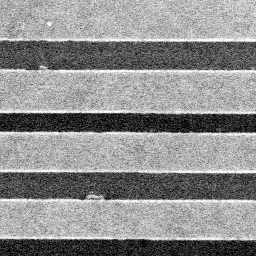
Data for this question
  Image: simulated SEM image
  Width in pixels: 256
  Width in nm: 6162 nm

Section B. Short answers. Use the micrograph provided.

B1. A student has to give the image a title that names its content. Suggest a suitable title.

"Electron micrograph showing lines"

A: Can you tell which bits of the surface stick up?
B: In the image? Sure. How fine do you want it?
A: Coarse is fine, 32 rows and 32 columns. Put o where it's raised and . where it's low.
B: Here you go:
oooooooooooooooooooooooooooooooo
oooooooooooooooooooooooooooooooo
oooooooooooooooooooooooooooooooo
oooooooooooooooooooooooooooooooo
oooooooooooooooooooooooooooooooo
................................
................................
................................
................................
oooooooooooooooooooooooooooooooo
oooooooooooooooooooooooooooooooo
oooooooooooooooooooooooooooooooo
oooooooooooooooooooooooooooooooo
oooooooooooooooooooooooooooooooo
................................
................................
................................
oooooooooooooooooooooooooooooooo
oooooooooooooooooooooooooooooooo
oooooooooooooooooooooooooooooooo
oooooooooooooooooooooooooooooooo
......................oooooooooo
................................
................................
................................
oooooooooooooooooooooooooooooooo
oooooooooooooooooooooooooooooooo
oooooooooooooooooooooooooooooooo
oooooooooooooooooooooooooooooooo
oooooooooooooooooooooooooooooooo
................................
................................